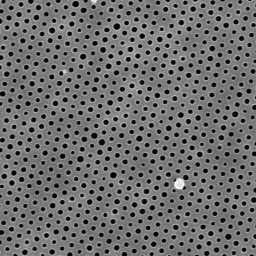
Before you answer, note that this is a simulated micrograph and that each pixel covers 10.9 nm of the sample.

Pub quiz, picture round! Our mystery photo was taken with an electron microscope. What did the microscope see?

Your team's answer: a regular array of holes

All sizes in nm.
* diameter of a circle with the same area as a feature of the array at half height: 50.6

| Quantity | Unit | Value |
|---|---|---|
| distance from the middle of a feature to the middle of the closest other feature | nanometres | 108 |